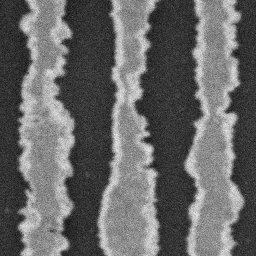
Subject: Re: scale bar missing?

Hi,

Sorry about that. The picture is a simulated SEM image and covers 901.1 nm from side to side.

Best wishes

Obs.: one or a few lines or trenches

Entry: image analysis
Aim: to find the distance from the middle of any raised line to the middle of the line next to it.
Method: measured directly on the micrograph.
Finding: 297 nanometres